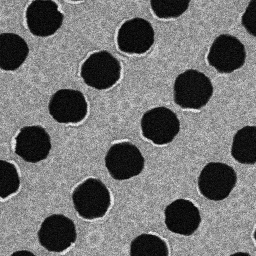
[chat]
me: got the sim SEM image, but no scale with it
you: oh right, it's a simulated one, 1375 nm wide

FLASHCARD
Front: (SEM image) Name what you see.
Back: a regular array of holes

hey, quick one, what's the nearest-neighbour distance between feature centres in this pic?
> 0.262 µm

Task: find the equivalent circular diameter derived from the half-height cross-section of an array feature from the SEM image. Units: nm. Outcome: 199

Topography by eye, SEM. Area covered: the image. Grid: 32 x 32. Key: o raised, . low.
oooo...oooooooooooo.....ooooooo.
ooo....oooooooooooo....oooooooo.
ooo.....oooooooo..oooooooooooo..
oooo...oooooooo....oooooooooooo.
..ooooooooooooo....oooooooo..ooo
...oooooooooooo....oooooooo...oo
...ooooooooo.ooo..oooooooo.....o
...oooooooo...oooooooooooo.....o
..oooooooo.....oooooooooooo...oo
oooooooooo.....ooooooo....oooooo
ooooooooooo...oooooooo....oooooo
ooooooo...oooooooooooo.....ooooo
oooooo.....ooooooooooo....oooooo
oooooo.....oooooooo..ooo.ooooooo
ooooooo....ooooooo....oooooooooo
oooooooooooooooooo....oooooooooo
oo....oooooooooooo....oooooooo..
oo....ooooooooooooo..oooooooo...
oo....oooooooo...oooooooooooo...
oo....ooooooo.....ooooooooooo...
.oooooooooooo.....oooooooo..oooo
..oooooooooooo....ooooooo....ooo
..ooooooooo.ooooooooooooo....ooo
..oooooooo...oooooooooooo....ooo
.oooooooo.....oooooooooooo..oooo
ooooooooo.....ooooooo...oooooooo
oooooooooo...oooooooo....ooooooo
oooooo...oooooooooooo....ooooooo
ooooo....oooooooooooo....ooooooo
ooooo....oooooooo..ooooooooooooo
ooooo....ooooooo.....ooooooooooo
oo..oooooooooooo.....ooooooooooo